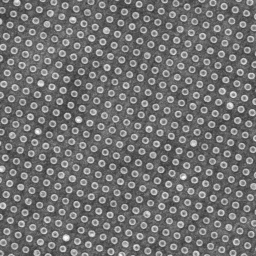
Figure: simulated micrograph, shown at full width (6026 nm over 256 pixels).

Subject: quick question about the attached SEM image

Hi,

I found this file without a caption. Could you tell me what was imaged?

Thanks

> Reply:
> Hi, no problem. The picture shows a regular array of raised bodies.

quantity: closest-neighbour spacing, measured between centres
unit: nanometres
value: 271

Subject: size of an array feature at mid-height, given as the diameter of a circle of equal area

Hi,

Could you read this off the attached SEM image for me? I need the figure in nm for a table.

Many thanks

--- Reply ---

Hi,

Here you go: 150